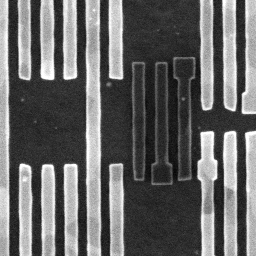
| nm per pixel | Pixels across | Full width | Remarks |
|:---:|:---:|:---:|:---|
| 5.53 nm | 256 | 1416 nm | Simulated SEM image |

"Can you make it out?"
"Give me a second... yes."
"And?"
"wiring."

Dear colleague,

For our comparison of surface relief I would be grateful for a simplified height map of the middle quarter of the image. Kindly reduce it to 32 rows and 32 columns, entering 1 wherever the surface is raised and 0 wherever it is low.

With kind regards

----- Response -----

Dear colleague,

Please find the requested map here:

11100011100111000111000111011111
11100011100111100111000111011111
11100011100111100111000111011111
11100011100011100111000111011111
00000011100000000111000111000111
00000011100000000111000111000111
00000011100000000111000111000111
00000011100000000111000111000111
00000011100000000111000111000111
00000011100000000111000111000111
00000011100000000111000111000111
00000011100000000111000111000111
00000011100000000111000111000111
00000011100000000111000111000111
00000011100000000111000111000111
00000011100000000111000111000111
00000011100000000111000111000111
00000011100000000111000111000111
00000011100000000111000111000111
00000011100000000111000111000111
00000011100000000111000111000111
00000011100000000111000111000111
00000011100000000111000111000111
00000011100000000111000111000111
00000011100000000111000111000111
11100011100111100111001111100111
11100011100111100111001111100111
11100011100011100111001111100111
11100011100011100011001111100111
11100011100111100000001111100000
11100011100111100000000000000000
11100011100111100000000000000000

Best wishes